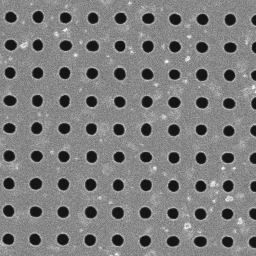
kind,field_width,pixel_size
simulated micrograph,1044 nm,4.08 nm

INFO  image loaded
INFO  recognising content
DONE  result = a regular array of holes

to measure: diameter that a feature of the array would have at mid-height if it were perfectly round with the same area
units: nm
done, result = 43.9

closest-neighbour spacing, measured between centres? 111 nm